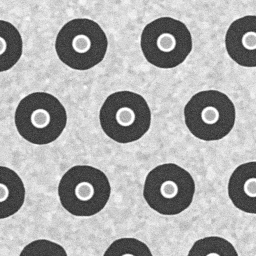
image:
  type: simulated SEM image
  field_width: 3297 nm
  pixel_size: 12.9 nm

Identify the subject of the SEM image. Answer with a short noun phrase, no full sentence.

an array of small figures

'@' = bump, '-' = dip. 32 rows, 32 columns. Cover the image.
@@@@@@@@@@@@@@@@@@@@@@@@@@@@@@@@
@@@@@@@@@@@@@@@@@@@@@@@@@@@@@@@@
@@@@@@@@@---@@@@@@@---@@@@@@@---
--@@@@@@-----@@@@@-----@@@@@@---
---@@@@------@@@@@--@---@@@@---@
@--@@@@--@@--@@@@@--@@--@@@@---@
---@@@@------@@@@@------@@@@----
--@@@@@@-----@@@@@-----@@@@@@---
-@@@@@@@@--@@@@@@@@@-@@@@@@@@@@@
@@@@@@@@@@@@@@@@@@@@@@@@@@@@@@@@
@@@@@@@@@@@@@@@@@@@@@@@@@@@@@@@@
@@@@@@@@@@@@@@---@@@@@@@@---@@@@
@@@----@@@@@@-----@@@@@@-----@@@
@@------@@@@@------@@@@---@--@@@
@@--@@--@@@@---@@--@@@@--@@---@@
@@--@@--@@@@@--@---@@@@------@@@
@@------@@@@@-----@@@@@@-----@@@
@@@----@@@@@@@---@@@@@@@@--@@@@@
@@@@@@@@@@@@@@@@@@@@@@@@@@@@@@@@
@@@@@@@@@@@@@@@@@@@@@@@@@@@@@@@@
@@@@@@@@@@@@@@@@@@@@--@@@@@@@@--
--@@@@@@-----@@@@@@-----@@@@@---
---@@@@@------@@@@------@@@@@--@
@--@@@@---@@--@@@@--@@--@@@@---@
@--@@@@---@---@@@@---@--@@@@@--@
---@@@@@-----@@@@@------@@@@@---
--@@@@@@@---@@@@@@@@---@@@@@@@@-
@@@@@@@@@@@@@@@@@@@@@@@@@@@@@@@@
@@@@@@@@@@@@@@@@@@@@@@@@@@@@@@@@
@@@@@@@@@@@@@@@@@@@@@@@@@@-@@@@@
@@@----@@@@@@@----@@@@@@-----@@@
@@@-----@@@@@------@@@@@------@@